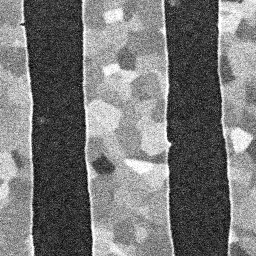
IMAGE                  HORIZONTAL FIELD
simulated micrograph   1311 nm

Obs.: one or a few lines or trenches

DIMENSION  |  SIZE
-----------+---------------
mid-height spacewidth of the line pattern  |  0.288 µm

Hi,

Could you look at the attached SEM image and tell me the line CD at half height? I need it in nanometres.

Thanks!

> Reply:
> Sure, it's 413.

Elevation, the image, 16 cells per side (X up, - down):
X----XXXXX----XX
X----XXXXX----XX
XX---XXXXX----XX
XX---XXXXX----XX
XX---XXXXX----XX
XX---XXXXX----XX
XX---XXXXX----XX
XX---XXXXX----XX
XX---XXXXX----XX
XX---XXXXXX---XX
XX---XXXXX----XX
XX----XXXXX---XX
XX----XXXXX---XX
XX----XXXXX---XX
XX----XXXXX---XX
XX----XXXXX---XX